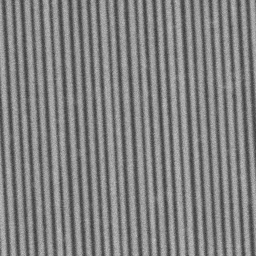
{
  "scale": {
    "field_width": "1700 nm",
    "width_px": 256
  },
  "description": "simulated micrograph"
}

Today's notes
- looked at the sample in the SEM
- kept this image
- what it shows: parallel lines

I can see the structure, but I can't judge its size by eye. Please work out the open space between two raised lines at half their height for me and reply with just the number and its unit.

35.6 nm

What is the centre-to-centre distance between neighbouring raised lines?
62.2 nm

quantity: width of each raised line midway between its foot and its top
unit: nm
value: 29.8